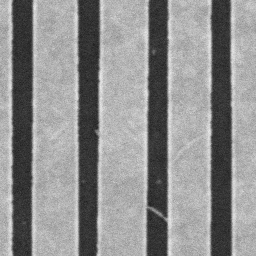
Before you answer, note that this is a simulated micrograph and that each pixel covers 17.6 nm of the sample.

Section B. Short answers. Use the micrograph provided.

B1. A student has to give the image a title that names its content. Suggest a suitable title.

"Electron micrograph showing lines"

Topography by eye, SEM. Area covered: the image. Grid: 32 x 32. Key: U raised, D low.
UDDDUUUUUUDDDUUUUUDDDUUUUUDDDUUU
UDDDUUUUUUDDDUUUUUDDDUUUUUDDDUUU
UDDDUUUUUUDDDUUUUUDDDUUUUUDDDUUU
UDDDUUUUUUDDDUUUUUDDDUUUUUDDDUUU
UDDDUUUUUUDDDUUUUUDDDUUUUUDDDUUU
UDDDUUUUUUDDDUUUUUDDDUUUUUDDDUUU
UDDDUUUUUUDDDUUUUUDDDUUUUUDDDUUU
UDDDUUUUUUDDDUUUUUDDDUUUUUDDDUUU
UDDDUUUUUUDDDUUUUUDDDUUUUUDDDUUU
UDDDUUUUUUDDDUUUUUDDDUUUUUDDDUUU
UDDDUUUUUUDDDUUUUUDDDUUUUUDDDUUU
UDDDUUUUUUDDDUUUUUDDDUUUUUDDDUUU
UDDDUUUUUUDDDUUUUUDDDUUUUUDDDUUU
UDDDUUUUUUDDDUUUUUDDDUUUUUDDDUUU
UDDDUUUUUUDDDUUUUUDDDUUUUUDDDUUU
UDDDUUUUUUDDDUUUUUDDDUUUUUDDDUUU
UDDDUUUUUUDDUUUUUUDDDUUUUUDDDUUU
UDDDUUUUUUDDUUUUUUDDDUUUUUDDDUUU
UDDDUUUUUUDDUUUUUUDDDUUUUUDDDUUU
UDDDUUUUUUDDUUUUUUDDDUUUUUDDDUUU
UDDDUUUUUUDDUUUUUUDDDUUUUUDDDUUU
UDDDUUUUUUDDUUUUUUDDDUUUUUDDDUUU
UDDDUUUUUUDDUUUUUUDDDUUUUUDDDUUU
UDDDUUUUUUDDUUUUUUDDDUUUUUDDDUUU
UDDDUUUUUUDDUUUUUUDDDUUUUUDDDUUU
UDDDUUUUUUDDUUUUUUDDDUUUUUDDDUUU
UDDDUUUUUUDDUUUUUUDDDUUUUUDDDUUU
UDDDUUUUUUDDUUUUUUDDDUUUUUDDDUUU
UDDDUUUUUUDDUUUUUUDDDUUUUUDDDUUU
UDDDUUUUUUDDUUUUUUDDDUUUUUDDDUUU
UDDDUUUUUUDDUUUUUUDDDUUUUUDDDUUU
UDDDUUUUUUDDUUUUUUDDDUUUUUDDDUUU